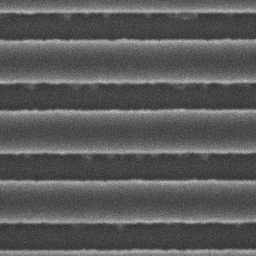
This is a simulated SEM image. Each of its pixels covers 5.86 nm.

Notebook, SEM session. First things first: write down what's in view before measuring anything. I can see lines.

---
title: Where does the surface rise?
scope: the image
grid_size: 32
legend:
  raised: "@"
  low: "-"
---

@@@@@@@@@@@@@@@@@@@@@@@@@@@@@@@@
---@@---------------------------
--------------------------------
--------------------------------
--------------------------------
@@@@@@@@@@@@@@@@@@@@@@@@@@@@@@@@
@@@@@@@@@@@@@@@@@@@@@@@@@@@@@@@@
@@@@@@@@@@@@@@@@@@@@@@@@@@@@@@@@
@@@@@@@@@@@@@@@@@@@@@@@@@@@@@@@@
@@@@@@@@@@@@@@@@@@@@@@@@@@@@@@@@
--------------------------------
--------------------------------
--------------------------------
--------------------------------
@@@@@@@@@@@@@@@@@@@@@@@@@@@@@@@@
@@@@@@@@@@@@@@@@@@@@@@@@@@@@@@@@
@@@@@@@@@@@@@@@@@@@@@@@@@@@@@@@@
@@@@@@@@@@@@@@@@@@@@@@@@@@@@@@@@
@@@@@@@@@@@@@@@@@@@@@@@@@@@@@@@@
--------------------------------
--------------------------------
--------------------------------
--------------------------------
@@@@@@@@@@@@@@@@@@@@@@@@@@@@@@@@
@@@@@@@@@@@@@@@@@@@@@@@@@@@@@@@@
@@@@@@@@@@@@@@@@@@@@@@@@@@@@@@@@
@@@@@@@@@@@@@@@@@@@@@@@@@@@@@@@@
@@@@@@@@@@@@@@@@@@@@@@@@@@@@@@@@
--------------------------------
--------------------------------
--------------------------------
@@@@@@@@@@@@@@@@@@@@@@@@@@@@@@@@